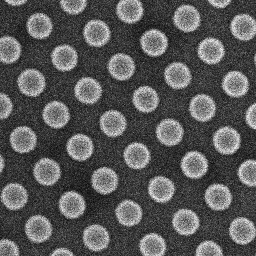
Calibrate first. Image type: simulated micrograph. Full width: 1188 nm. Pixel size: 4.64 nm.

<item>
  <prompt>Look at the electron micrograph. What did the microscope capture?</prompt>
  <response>a regular array of raised bodies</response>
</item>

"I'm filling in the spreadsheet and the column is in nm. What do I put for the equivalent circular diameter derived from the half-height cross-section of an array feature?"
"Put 117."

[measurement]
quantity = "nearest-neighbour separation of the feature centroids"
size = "0.187 microns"